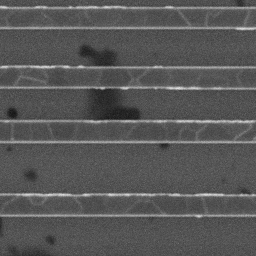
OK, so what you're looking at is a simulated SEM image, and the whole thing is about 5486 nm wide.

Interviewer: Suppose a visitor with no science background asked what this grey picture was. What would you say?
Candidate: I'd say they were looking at lines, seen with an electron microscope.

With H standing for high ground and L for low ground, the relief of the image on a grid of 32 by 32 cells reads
LLLLLLLLLLLLLLLLLLLLLLLLLLLLLLLL
HHHHHHHHHHHHHHHHHHHHHHHHHHHHHHHH
HHHHHHHHHHHHHHHHHHHHHHHHHHHHHHHH
LLLLLLLLLLLLLLLLLLLLLLLLLLLLLHHH
LLLLLLLLLLLLLLLLLLLLLLLLLLLLLLLL
LLLLLLLLLLLLLLLLLLLLLLLLLLLLLLLL
LLLLLLLLLLLLLLLLLLLLLLLLLLLLLLLL
LLLLLLLLLLLLLLLLLLLLLLLLLLLLLLLL
HHHHHHHHHHHHHHHHHHHHHHHHHHHHHHHH
HHHHHHHHHHHHHHHHHHHHHHHHHHHHHHHH
HHHHHHHHHHHHHHHHHHHHHHHHHHHHHHHH
LLLLLLLLLLLLLLLLLLLLLLLLLLLLLLLL
LLLLLLLLLLLLLLLLLLLLLLLLLLLLLLLL
LLLLLLLLLLLLLLLLLLLLLLLLLLLLLLLL
LLLLLLLLLLLLLLLLLLLLLLLLLLLLLLLL
HHHHHHHHHHHHHHHHHHHHHHHHHHHHHHHH
HHHHHHHHHHHHHHHHHHHHHHHHHHHHHHHH
HHHHHHHHHHHHHHHHHHHHHHHHHHHHHHHH
LLLLLLLLLLLLLLLLLLLLLLLLLLLLLLLL
LLLLLLLLLLLLLLLLLLLLLLLLLLLLLLLL
LLLLLLLLLLLLLLLLLLLLLLLLLLLLLLLL
LLLLLLLLLLLLLLLLLLLLLLLLLLLLLLLL
LLLLLLLLLLLLLLLLLLLLLLLLLLLLLLLL
LLLLLLLLLLLLLLLLLLLLLLLLLLLLLLLL
HHHHHHHHHHHHHHHHHHHHHHHHHHHHHHHH
HHHHHHHHHHHHHHHHHHHHHHHHHHHHHHHH
HHHHHHHHHHHHHHHHHHHHHHHHHHHHHHHH
LLLLLLLLLLLLLLLLLLLLLLLLLLLLLLLL
LLLLLLLLLLLLLLLLLLLLLLLLLLLLLLLL
LLLLLLLLLLLLLLLLLLLLLLLLLLLLLLLL
LLLLLLLLLLLLLLLLLLLLLLLLLLLLLLLL
LLLLLLLLLLLLLLLLLLLLLLLLLLLLLLLL